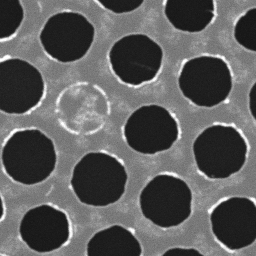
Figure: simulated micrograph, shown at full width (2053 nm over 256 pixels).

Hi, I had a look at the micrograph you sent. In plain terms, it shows a regular array of holes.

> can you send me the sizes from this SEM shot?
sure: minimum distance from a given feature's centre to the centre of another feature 72.2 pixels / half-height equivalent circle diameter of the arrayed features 419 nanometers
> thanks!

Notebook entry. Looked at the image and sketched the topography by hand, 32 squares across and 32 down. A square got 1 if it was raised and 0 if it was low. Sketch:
00011111111110000011100000011111
00011111011111001111100000011110
00011100000111111111100000111100
00111000000011111111110000111000
01111000000011110011111111111000
11111000000111000000111111111100
11111100000111000000111111111111
10011110001111000000111100001111
00001111111111000000111000000111
00000111111111100001110000000111
00000111111111110111110000000111
00000111111111111111111000000110
00000111111111111111111100001110
00001111111111111000011111111110
11111111111111110000011111111111
11111111111111110000001111111111
11000111111111110000001110000011
10000011111111110000001100000001
00000001111111110000011100000001
00000001111000111111111100000001
00000001110000011111111110000011
10000011100000001111111110000011
11000011100000001110000111111111
11111111100000001100000011111111
11111111110000011000000011111111
11111111111000111100000011100000
11100000111111111100000011100000
11100000111111111110000111000000
11000000011111001111111111000000
11100000011100000111111111100000
11100000111000000111111111110001
11111011111000000011100001111111